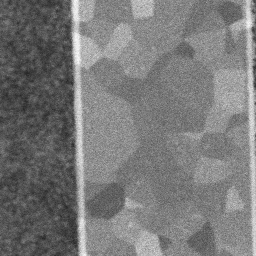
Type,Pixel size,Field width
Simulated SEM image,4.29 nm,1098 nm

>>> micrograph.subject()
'one or a few lines or trenches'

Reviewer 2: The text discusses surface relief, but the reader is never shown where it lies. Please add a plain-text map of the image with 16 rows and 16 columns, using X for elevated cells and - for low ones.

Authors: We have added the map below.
-----XXXXXXXXXXX
-----XXXXXXXXXXX
-----XXXXXXXXXXX
-----XXXXXXXXXXX
-----XXXXXXXXXXX
-----XXXXXXXXXXX
-----XXXXXXXXXXX
-----XXXXXXXXXXX
-----XXXXXXXXXXX
-----XXXXXXXXXXX
-----XXXXXXXXXXX
-----XXXXXXXXXXX
-----XXXXXXXXXXX
-----XXXXXXXXXXX
-----XXXXXXXXXXX
-----XXXXXXXXXXX